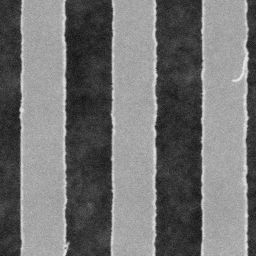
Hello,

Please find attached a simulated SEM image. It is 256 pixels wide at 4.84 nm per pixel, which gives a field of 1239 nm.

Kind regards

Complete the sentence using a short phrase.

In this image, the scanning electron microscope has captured lines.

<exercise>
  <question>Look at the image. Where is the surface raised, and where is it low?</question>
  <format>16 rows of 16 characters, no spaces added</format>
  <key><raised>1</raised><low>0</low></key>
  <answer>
0111000111000110
0111000111000110
0111000111000110
0111000111000110
0111000111000110
0111000111000110
0111000111000110
0111000111000110
0111000111000110
0111000111000110
0111000111000110
0111000111000110
0111000111000110
0111000111000110
0111000111000110
0111000111000110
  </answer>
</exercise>